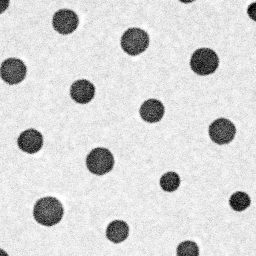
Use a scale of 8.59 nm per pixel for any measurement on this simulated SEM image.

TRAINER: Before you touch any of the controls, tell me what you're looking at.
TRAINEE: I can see a regular array of holes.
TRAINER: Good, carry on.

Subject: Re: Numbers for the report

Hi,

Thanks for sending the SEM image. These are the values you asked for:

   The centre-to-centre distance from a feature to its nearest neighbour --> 618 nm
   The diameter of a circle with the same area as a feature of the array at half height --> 236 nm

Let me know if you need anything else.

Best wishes